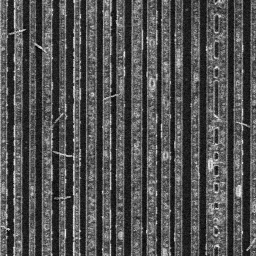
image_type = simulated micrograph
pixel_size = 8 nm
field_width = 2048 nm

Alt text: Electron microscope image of parallel lines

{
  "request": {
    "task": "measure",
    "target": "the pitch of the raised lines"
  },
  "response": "117 nm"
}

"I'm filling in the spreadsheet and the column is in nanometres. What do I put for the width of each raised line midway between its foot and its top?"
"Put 61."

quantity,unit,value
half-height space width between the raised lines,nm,61